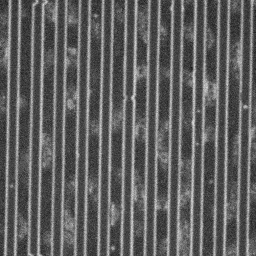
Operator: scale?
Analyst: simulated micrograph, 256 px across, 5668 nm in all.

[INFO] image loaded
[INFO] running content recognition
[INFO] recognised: parallel lines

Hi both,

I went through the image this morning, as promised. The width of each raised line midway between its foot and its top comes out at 221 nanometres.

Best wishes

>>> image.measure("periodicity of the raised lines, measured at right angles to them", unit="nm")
514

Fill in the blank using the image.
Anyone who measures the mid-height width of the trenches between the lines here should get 0.28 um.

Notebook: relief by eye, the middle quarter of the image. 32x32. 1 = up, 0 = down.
00001100001100011100011000011000
00001100001100011100011000011000
00001100001100011100011000011000
00011100011100011100011000011000
00011100011100011100011000011000
00011100011100011100011000011000
00001100011100011100011000011000
00001100011100011100011000011000
00001100011100011000011000011000
00001100011100011100011000011000
00001100011100011100011000011000
00001100011100011100011000011000
00001100011100011100011000011000
00001100011100011100011000011000
00001100011100011000011000011000
00001100011100011000011000011000
00011100011100011000011000011000
00011100011100011000011000011000
00011100011100011000011000011000
00011100011100011000011000011000
00011100011100011000011000011000
00011100011000011000011000011000
00011100011000011000011000011000
00011100011000011000011000011000
00011100011000011000011000011000
00011100011000011000011000011000
00011100011000011000011000011000
00011100011000011000011000011000
00011100011000011000011000111000
00011000011000011000011000111000
00011000011000011000011000111000
00011000011000011000011000111000